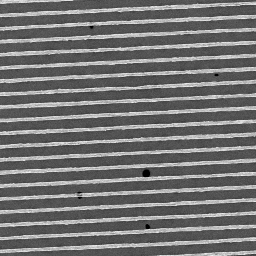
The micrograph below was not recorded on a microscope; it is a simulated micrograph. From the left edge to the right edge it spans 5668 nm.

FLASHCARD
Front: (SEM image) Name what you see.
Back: parallel lines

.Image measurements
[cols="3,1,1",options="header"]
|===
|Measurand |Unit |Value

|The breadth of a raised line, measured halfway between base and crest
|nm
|71.9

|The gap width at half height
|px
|9.86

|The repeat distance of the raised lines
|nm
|290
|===